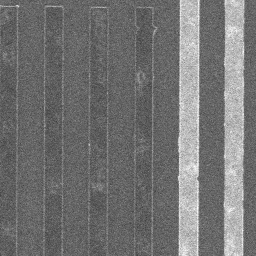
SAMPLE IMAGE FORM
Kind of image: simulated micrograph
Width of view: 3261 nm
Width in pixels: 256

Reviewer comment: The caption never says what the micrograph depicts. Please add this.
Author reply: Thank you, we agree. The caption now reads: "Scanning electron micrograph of parallel lines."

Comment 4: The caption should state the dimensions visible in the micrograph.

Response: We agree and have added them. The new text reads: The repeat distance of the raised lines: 575 nm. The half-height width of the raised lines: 226 nm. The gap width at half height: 346 nm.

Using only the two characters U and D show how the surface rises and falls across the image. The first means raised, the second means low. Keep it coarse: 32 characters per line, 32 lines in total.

DDDDDDDDDDDDDDDDDDDDDDDUUDDDUUDD
UUDDDDUUDDDUUDDDDUUDDDDUUDDDUUDD
UUDDDDUUDDDUUDDDDUUDDDDUUDDDUUDD
UUDDDDUUDDDUUDDDDUUDDDDUUDDDUUDD
UUDDDDUUDDDUUDDDDUUDDDDUUDDDUUDD
UUDDDDUUDDDUUDDDDUUDDDDUUDDDUUDD
UUDDDDUUDDDUUDDDDUUDDDDUUDDDUUDD
UUDDDDUUDDDUUDDDDUUDDDDUUDDDUUDD
UUDDDDUUDDDUUDDDDUUDDDDUUDDDUUDD
UUDDDDUUDDDUUDDDDUUDDDDUUDDDUUDD
UUDDDDUUDDDUUDDDDUUDDDDUUDDDUUDD
UUDDDDUUDDDUUDDDDUUDDDDUUDDDUUDD
UUDDDDUUDDDUUDDDDUUDDDDUUDDDUUDD
UUDDDDUUDDDUUDDDDUUDDDDUUDDDUUDD
UUDDDDUUDDDUUDDDDUUDDDDUUDDDUUDD
UUDDDDUUDDDUUDDDDUUDDDDUUDDDUUDD
UUDDDDUUDDDUUDDDDUUDDDDUUDDDUUDD
UUDDDDUUDDDUUDDDDUUDDDUUUDDDUUDD
UUDDDDUUDDDUUDDDDUUDDDUUUDDDUUDD
UUDDDDUUDDDUUDDDDUUDDDDUUDDDUUDD
UUDDDDUUDDDUUDDDDUUDDDDUUDDDUUDD
UUDDDDUUDDDUUDDDDUUDDDDUUDDDUUDD
UUDDDDUUDDDUUDDDDUUDDDUUUDDDUUDD
UUDDDDUUDDDUDDDDDUUDDDDUUDDDUUDD
UUDDDDUUDDDUUDDDDUUDDDDUUDDDUUDD
UUDDDDUUDDDUUDDDDUUDDDDUUDDDUUDD
UUDDDDUUDDDUUDDDDUUDDDDUUDDDUUDD
UUDDDDUUDDDUUDDDDUUDDDDUUDDDUUDD
UUDDDDUUDDDUUDDDDUUDDDDUUDDDUUDD
UUDDDDUUDDDUUDDDDUUDDDDUUDDDUUDD
UUDDDDUUDDDUUDDDDUUDDDDUUDDDUUDD
UUDDDDUUDDDUUDDDDUUDDDDUUDDDUUDD